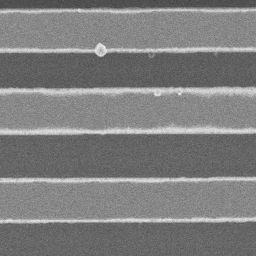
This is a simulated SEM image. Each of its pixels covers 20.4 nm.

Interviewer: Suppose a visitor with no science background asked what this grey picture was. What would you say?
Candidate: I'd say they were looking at lines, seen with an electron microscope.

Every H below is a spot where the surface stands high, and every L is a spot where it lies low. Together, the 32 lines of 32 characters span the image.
LLLLLLLLLLLLLLLLLLLLLLLLLLLLLLLL
HHHHHHHHHHHHHHHHHHHHHHHHHHHHHHHH
HHHHHHHHHHHHHHHHHHHHHHHHHHHHHHHH
HHHHHHHHHHHHHHHHHHHHHHHHHHHHHHHH
HHHHHHHHHHHHHHHHHHHHHHHHHHHHHHHH
HHHHHHHHHHHHHHHHHHHHHHHHHHHHHHHH
LLLLLLLLLLLLHHLLLLLLLLLLLLLLLLLL
LLLLLLLLLLLLLLLLLLLLLLLLLLLLLLLL
LLLLLLLLLLLLLLLLLLLLLLLLLLLLLLLL
LLLLLLLLLLLLLLLLLLLLLLLLLLLLLLLL
LLLLLLLLLLLLLLLLLLLLLLLLLLLLLLLL
HHHHHHHHHHHHHHHHHHHHHHHHHHHHHHHH
HHHHHHHHHHHHHHHHHHHHHHHHHHHHHHHH
HHHHHHHHHHHHHHHHHHHHHHHHHHHHHHHH
HHHHHHHHHHHHHHHHHHHHHHHHHHHHHHHH
HHHHHHHHHHHHHHHHHHHHHHHHHHHHHHHH
HHHHHHHHHHHHHHHHHHHHHHHHHHHHHHHH
LLLLLLLLLLLLLLLLLLLLLLLLLLLLLLLL
LLLLLLLLLLLLLLLLLLLLLLLLLLLLLLLL
LLLLLLLLLLLLLLLLLLLLLLLLLLLLLLLL
LLLLLLLLLLLLLLLLLLLLLLLLLLLLLLLL
LLLLLLLLLLLLLLLLLLLLLLLLLLLLLLLL
HHHHHHHHHHHHHHHHHHHHHHHHHHHHHHHH
HHHHHHHHHHHHHHHHHHHHHHHHHHHHHHHH
HHHHHHHHHHHHHHHHHHHHHHHHHHHHHHHH
HHHHHHHHHHHHHHHHHHHHHHHHHHHHHHHH
HHHHHHHHHHHHHHHHHHHHHHHHHHHHHHHH
HHHHHHHHHHHHHHHHHHHHHHHHHHHHHHHL
LLLLLLLLLLLLLLLLLLLLLLLLLLLLLLLL
LLLLLLLLLLLLLLLLLLLLLLLLLLLLLLLL
LLLLLLLLLLLLLLLLLLLLLLLLLLLLLLLL
LLLLLLLLLLLLLLLLLLLLLLLLLLLLLLLL